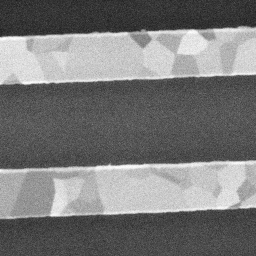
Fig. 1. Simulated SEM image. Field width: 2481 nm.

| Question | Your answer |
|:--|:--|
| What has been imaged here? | lines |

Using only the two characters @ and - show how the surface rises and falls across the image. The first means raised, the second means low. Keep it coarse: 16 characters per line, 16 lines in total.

----------------
----------------
@@@@@@@@@@@@@@@@
@@@@@@@@@@@@@@@@
@@@@@@@@@@@@@@@@
----------------
----------------
----------------
----------------
----------------
-----@@@@@@@@@@@
@@@@@@@@@@@@@@@@
@@@@@@@@@@@@@@@@
@@@-------------
----------------
----------------